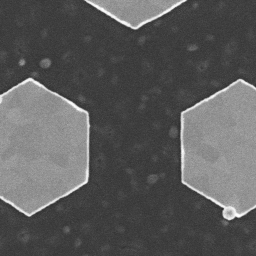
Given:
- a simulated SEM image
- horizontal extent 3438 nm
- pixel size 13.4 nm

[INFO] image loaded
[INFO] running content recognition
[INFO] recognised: raised bodies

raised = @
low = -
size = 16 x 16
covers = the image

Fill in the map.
------@@@@@-----
--------@-------
----------------
----------------
----------------
-@@-----------@@
@@@@@-------@@@@
@@@@@@-----@@@@@
@@@@@@-----@@@@@
@@@@@@-----@@@@@
@@@@@@-----@@@@@
@@@@@-------@@@@
@@@@---------@@@
--------------@-
----------------
----------------